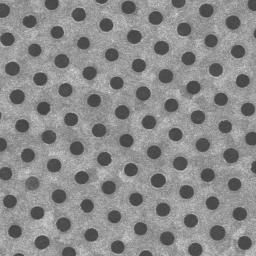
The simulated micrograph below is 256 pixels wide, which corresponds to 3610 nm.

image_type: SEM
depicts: a regular array of holes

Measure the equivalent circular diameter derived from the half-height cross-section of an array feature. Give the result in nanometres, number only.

202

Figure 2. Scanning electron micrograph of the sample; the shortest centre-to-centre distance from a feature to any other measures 28.3 px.